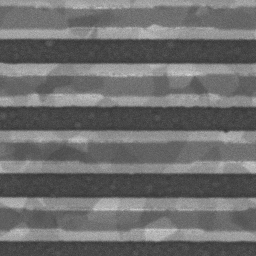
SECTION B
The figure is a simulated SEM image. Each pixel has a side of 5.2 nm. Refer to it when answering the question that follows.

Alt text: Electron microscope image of one or a few lines or trenches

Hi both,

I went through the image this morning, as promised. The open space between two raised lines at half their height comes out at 171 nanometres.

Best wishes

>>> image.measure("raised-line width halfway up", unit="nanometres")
180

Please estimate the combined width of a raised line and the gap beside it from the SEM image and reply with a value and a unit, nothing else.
349 nanometers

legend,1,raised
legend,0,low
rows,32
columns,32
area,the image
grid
11111111111111111111111111111111
11111111111111111111111111111111
11111111111111111111111111111111
11111111111111111111111111111111
00000000000000000000000000000000
00000000000000000000000000000000
00000000000000000000000000000000
00000000000000000000000000000000
10011111111000000000000000000000
11111111111111111111111111111111
11111111111111111111111111111111
11111111111111111111111111111111
11111111111111111111111111111111
00000000000000000000000000000000
00000000000000000000000000000000
00000000000000000000000000000000
00000000000000000000000000000000
11111111111111111111111111111111
11111111111111111111111111111111
11111111111111111111111111111111
11111111111111111111111111111111
00000000000000000000000000000000
00000000000000000000000000000000
00000000000000000000000000000000
00000000000000000000000000000000
11111111111111111111111111111111
11111111111111111111111111111111
11111111111111111111111111111111
11111111111111111111111111111111
11111111111111111111111111111111
00000000000000000000000000000000
00000000000000000000000000000000